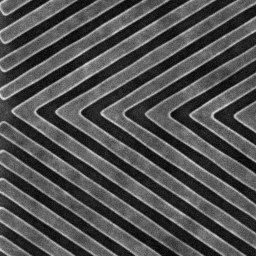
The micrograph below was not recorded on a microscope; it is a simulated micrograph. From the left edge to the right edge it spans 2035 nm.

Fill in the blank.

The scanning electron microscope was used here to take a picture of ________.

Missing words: groups of lines, slits or small figures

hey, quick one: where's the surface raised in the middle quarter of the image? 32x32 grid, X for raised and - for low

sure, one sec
-----XXXXXX-----XXXXXXX-----XXXX
---XXXXXX------XXXXXX-----XXXXXX
-XXXXXXX-----XXXXXX------XXXXXX-
XXXXXX------XXXXXX-----XXXXXX---
XXXXX-----XXXXXX-----XXXXXXX----
XXX-----XXXXXX------XXXXXX-----X
X-----XXXXXX------XXXXXX-----XXX
-----XXXXXX-----XXXXXX------XXXX
---XXXXXX------XXXXXX-----XXXXXX
-XXXXXX------XXXXXX-----XXXXXX--
XXXXXX------XXXXX------XXXXXX---
XXXX------XXXXXX-----XXXXXX-----
XXXX-----XXXXXX-----XXXXXXX-----
XXXXX------XXXXX-----XXXXXX-----
-XXXXXX-----XXXXX------XXXXXX---
---XXXXX-----XXXXXX-----XXXXXX--
----XXXXXX-----XXXXXX----XXXXXX-
X-----XXXXX-----XXXXXX-----XXXXX
XX-----XXXXX------XXXXXX----XXXX
XXX------XXXXX-----XXXXXX-----XX
XXXXX-----XXXXX-----XXXXXXX----X
XXXXXX-----XXXXXX-----XXXXXX----
--XXXXXX-----XXXXXX----XXXXXXX--
---XXXXXX-----XXXXXX-----XXXXXX-
-----XXXXXX----XXXXXXX----XXXXXX
XX-----XXXXX-----XXXXXX-----XXXX
XXX-----XXXXXX----XXXXXXX----XXX
XXXXX-----XXXXX-----XXXXXX-----X
XXXXXX-----XXXXXX-----XXXXXX----
--XXXXXX-----XXXXX-----XXXXXX---
---XXXXXX-----XXXXXX-----XXXXXX-
-----XXXXXX----XXXXXX-----XXXXXX